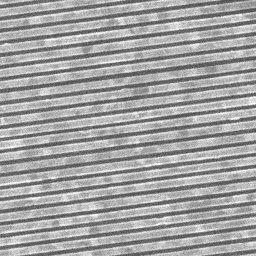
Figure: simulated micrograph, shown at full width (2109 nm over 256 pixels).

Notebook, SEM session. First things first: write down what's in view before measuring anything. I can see parallel lines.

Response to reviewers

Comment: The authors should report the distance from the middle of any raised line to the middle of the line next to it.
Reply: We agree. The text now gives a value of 98.6 nm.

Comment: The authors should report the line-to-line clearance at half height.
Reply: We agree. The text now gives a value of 40.8 nm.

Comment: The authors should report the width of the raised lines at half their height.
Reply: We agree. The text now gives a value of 56.2 nm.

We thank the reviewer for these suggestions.